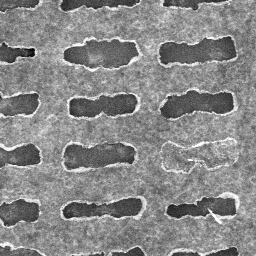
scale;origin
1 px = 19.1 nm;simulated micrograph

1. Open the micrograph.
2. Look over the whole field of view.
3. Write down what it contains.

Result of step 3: holes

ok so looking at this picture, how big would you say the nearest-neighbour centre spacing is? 1000 nanometres